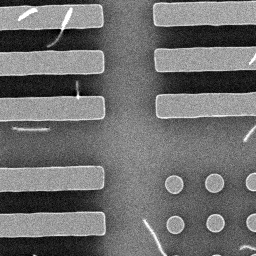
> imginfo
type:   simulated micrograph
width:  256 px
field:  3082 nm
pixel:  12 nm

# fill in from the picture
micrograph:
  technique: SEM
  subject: groups of lines, slits or small figures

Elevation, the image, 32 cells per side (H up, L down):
LLLLLLLLLLLLLLLLLLLLHHHHHHHHHHHH
HHHHHHHHHHHHHLLLLLLHHHHHHHHHHHHH
HHHHHHHHHHHHHLLLLLLHHHHHHHHHHHHH
HHHHHHHHHHHLLLLLLLLLLLLLLLLLLLLL
LLLLLLLLLLLLLLLLLLLLLLLLLLLLLLLL
LLLLLLLLLLLLLLLLLLLLLLLLLLLLLLLL
LLLLLHHHHHHHHLLLLLLLHHHHHHHHHHHH
HHHHHHHHHHHHHLLLLLLHHHHHHHHHHHHH
HHHHHHHHHHHHHLLLLLLLHHHHHHHHHHHH
LLLLLLLLLLLLLLLLLLLLLLLLLLLLLLLL
LLLLLLLLLLLLLLLLLLLLLLLLLLLLLLLL
LLLLLLLLLLLLLLLLLLLLLLLLLLLLLLLL
HHHHHHHHHHHHHLLLLLLLHHHHHHHHHHHH
HHHHHHHHHHHHHLLLLLLLHHHHHHHHHHHH
HHHHHHHHHHHHHLLLLLLLHHHHHHLLLLLL
LLLLLLLLLLLLLLLLLLLLLLLLLLLLLLLL
LLLLLLLLLLLLLLLLLLLLLLLLLLLLLLLL
LLLLLLLLLLLLLLLLLLLLLLLLLLLLLLLL
LLLLLLLLLLLLLLLLLLLLLLLLLLLLLLLL
LLLLLLLLLLLLLLLLLLLLLLLLLLLLLLLL
LLLLLLLLLLLLLLLLLLLLLLLLLLLLLLLL
HHHHHHHHHHHHHLLLLLLLLLLLLLLLLLLL
HHHHHHHHHHHHHLLLLLLLLHHLLLHHLLLH
HHHHHHHHHHHHHLLLLLLLLHHLLLHHLLLH
LLLLLLLLLLLLLLLLLLLLLLLLLLLLLLLL
LLLLLLLLLLLLLLLLLLLLLLLLLLLLLLLL
LLLLLLLLLLLLLLLLLLLLLLLLLLLLLLLL
HHHHHHHHHHHHHLLLLLLLLHHLLLHHLLLH
HHHHHHHHHHHHHLLLLLLLLHHLLLHHLLLH
HHHHHHLLLLLLLLLLLLLLLLLLLLLLLLLL
LLLLLLLLLLLLLLLLLLLLLLLLLLLLLLLL
LLLLLLLLLLLLLLLLLLLLLLLLLLLLLLLL